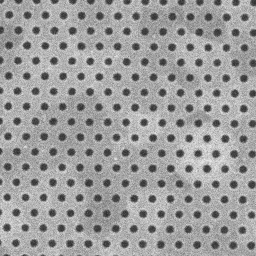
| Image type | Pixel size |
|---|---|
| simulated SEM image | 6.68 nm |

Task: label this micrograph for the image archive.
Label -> a regular array of holes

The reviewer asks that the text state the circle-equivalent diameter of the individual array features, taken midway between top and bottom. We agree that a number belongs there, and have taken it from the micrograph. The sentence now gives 58.4 nanometres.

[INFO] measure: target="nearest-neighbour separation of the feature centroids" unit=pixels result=17.4